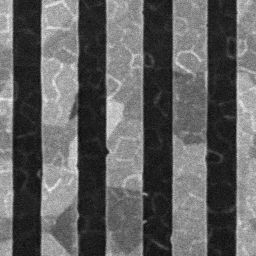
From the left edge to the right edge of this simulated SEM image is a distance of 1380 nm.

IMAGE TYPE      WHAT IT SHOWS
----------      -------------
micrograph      one or a few lines or trenches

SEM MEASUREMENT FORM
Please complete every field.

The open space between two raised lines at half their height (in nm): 163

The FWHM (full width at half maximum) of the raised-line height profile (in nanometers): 182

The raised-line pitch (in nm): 345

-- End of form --